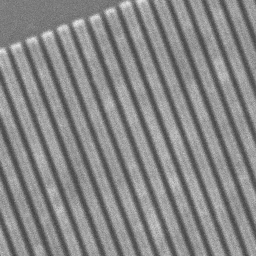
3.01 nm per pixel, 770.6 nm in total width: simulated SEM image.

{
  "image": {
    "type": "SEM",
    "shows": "parallel lines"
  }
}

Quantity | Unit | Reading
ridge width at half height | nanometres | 29.2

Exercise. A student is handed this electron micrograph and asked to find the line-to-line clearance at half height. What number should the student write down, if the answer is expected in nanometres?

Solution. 21.1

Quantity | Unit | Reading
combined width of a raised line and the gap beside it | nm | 50.1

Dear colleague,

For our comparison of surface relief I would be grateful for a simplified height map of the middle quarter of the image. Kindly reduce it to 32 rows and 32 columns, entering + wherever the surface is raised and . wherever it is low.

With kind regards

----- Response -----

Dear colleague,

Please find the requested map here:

..++..+++..++..+++..++..+++..++.
..+++..++..+++..++..+++..++..+++
+..++..+++..++..+++..++..+++..++
+..++...++..+++..++..+++.+++..++
+...++..++..+++..++..+++..++..++
++..++..+++..++..+++..++..+++..+
++..+++..++..+++..++..+++..++..+
++...++..++...++..+++.+++..+++.+
.++..++..+++..++..+++..++..+++..
.++..+++..++..+++..++..+++..++..
.+++..++..+++..++..+++..++..+++.
..++..++...++..+++..++..+++.+++.
..++...++..++..+++..++..+++..++.
+.+++..++..+++..++..+++..++..+++
+..++..+++..++..+++..++..+++..++
+..++...++..++...++..+++.+++..++
++..++..++..+++..++..+++..++..++
++..++..+++..++..+++..++..+++..+
++..+++..++..+++..++..+++..++..+
+++..++..++...++..+++..++..+++.+
.++..++...++..++..+++..++..+++..
.+++.+++..++..+++..++..+++..++..
.+++..++..+++..++..+++..++..+++.
..++..++...++..++...++..+++.+++.
..+++..++..++..+++..++..+++..++.
+.+++..++..+++..++..+++..++..+++
+..++..+++..++..+++..++..+++..++
+..+++..++..+++..++..+++..++..++
++..++..++...++..++..+++..++..++
++..+++.+++..++..+++..++..+++..+
++..+++..++..+++..++..+++..++..+
+++..++..++...++..++...++..+++.+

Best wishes